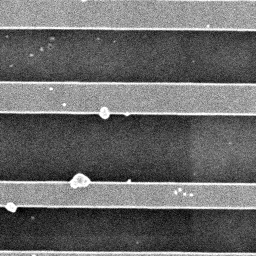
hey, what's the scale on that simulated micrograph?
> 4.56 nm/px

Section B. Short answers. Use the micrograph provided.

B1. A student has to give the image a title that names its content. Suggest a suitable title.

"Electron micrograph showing groups of lines, slits or small figures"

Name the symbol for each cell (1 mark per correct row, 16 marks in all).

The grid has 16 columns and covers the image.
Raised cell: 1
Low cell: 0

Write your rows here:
1111111111111111
1111111111111111
0000000000000000
0000000000000000
0000000000000000
1111111111111111
1111111111111111
0000000000000000
0000000000000000
0000000000000000
0000000000000000
1111111111111111
1111111111111111
0000000000000000
0000000000000000
0000000000000000